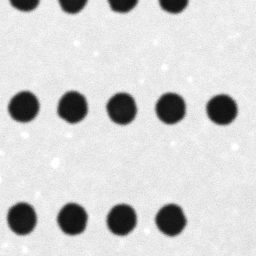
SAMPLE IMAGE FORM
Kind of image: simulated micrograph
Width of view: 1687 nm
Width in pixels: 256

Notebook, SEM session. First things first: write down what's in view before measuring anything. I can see a regular array of holes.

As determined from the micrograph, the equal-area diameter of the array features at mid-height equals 208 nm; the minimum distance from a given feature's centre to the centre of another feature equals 324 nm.